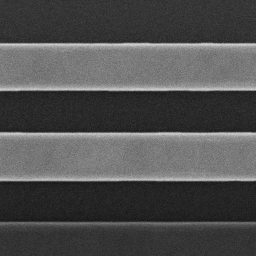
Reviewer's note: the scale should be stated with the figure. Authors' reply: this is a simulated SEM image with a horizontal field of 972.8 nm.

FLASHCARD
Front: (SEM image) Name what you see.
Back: wiring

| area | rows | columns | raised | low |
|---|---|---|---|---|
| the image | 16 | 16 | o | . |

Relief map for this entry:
................
................
................
oooooooooooooooo
oooooooooooooooo
oooooooooooooooo
................
................
oooooooooooooooo
oooooooooooooooo
oooooooooooooooo
................
................
................
oooooooooooooooo
oooooooooooooooo